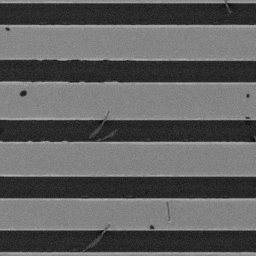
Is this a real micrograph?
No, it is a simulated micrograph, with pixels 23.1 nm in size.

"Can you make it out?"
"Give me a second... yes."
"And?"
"lines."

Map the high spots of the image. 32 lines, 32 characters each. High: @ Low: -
--------------------------------
--------------------------------
--------------------------------
@@@@@@@@@@@@@@@@@@@@@@@@@@@@@@@@
@@@@@@@@@@@@@@@@@@@@@@@@@@@@@@@@
@@@@@@@@@@@@@@@@@@@@@@@@@@@@@@@@
@@@@@@@@@@@@@@@@@@@@@@@@@@@@@@@@
--------------------------------
--------------------------------
--------------------------------
@@@@@@@@@@@@@@@@@@@@@@@@@@@@@@@@
@@@@@@@@@@@@@@@@@@@@@@@@@@@@@@@@
@@@@@@@@@@@@@@@@@@@@@@@@@@@@@@@@
@@@@@@@@@@@@@@@@@@@@@@@@@@@@@@@@
@@@@@@@@@@@@@@@@@@@@@@@@@@@@@@@@
--------------------------------
--------------------------------
--------------------------------
@@@@@@@@@@@@@@@@@@@@@@@@@@@@@@@@
@@@@@@@@@@@@@@@@@@@@@@@@@@@@@@@@
@@@@@@@@@@@@@@@@@@@@@@@@@@@@@@@@
@@@@@@@@@@@@@@@@@@@@@@@@@@@@@@@@
--------------------------------
--------------------------------
--------------------------------
@@@@@@@@@@@@@@@@@@@@@@@@@@@@@@@@
@@@@@@@@@@@@@@@@@@@@@@@@@@@@@@@@
@@@@@@@@@@@@@@@@@@@@@@@@@@@@@@@@
@@@@@@@@@@@@@@@@@@@@@@@@@@@@@@@@
--------------------------------
--------------------------------
--------------------------------